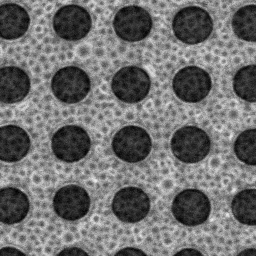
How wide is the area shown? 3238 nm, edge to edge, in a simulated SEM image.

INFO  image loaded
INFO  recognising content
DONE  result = a regular array of holes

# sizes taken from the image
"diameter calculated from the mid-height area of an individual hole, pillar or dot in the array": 500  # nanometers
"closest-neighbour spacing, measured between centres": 0.746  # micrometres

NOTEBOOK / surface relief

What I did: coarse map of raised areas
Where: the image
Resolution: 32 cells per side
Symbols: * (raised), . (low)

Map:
..*****************************.
...****....****....***....***...
....**.....***.....***.....**...
....***....***.....**......**...
...****....****...****....***...
***********************..*******
********************************
********************************
...*****..*****...*****..*****..
....***....***.....***....***...
....**.....***.....**......**...
....**.....***.....***....***...
...****...*****...*****..*****..
********************************
********************************
********************************
...****....****...****....****..
....**.....***.....**.....***...
....**.....***.....**.....***...
...****....****....***....***...
***********************.*******.
********************************
********************************
..******..*****..**************.
...****....***.....***....***...
....***....***.....**.....***...
....***....***.....**.....***...
...*****..*****...****....****..
********************************
********************************
********************************
...****....****...****...*****..